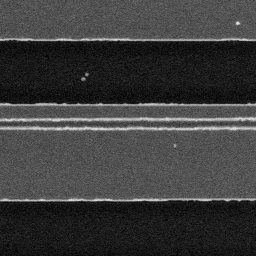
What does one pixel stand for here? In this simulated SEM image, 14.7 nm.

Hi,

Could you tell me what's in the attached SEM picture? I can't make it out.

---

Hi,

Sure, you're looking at lines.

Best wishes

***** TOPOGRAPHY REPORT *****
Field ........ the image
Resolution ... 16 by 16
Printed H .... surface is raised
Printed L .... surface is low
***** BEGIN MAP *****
HHHHHHHHHHHHHHHH
HHHHHHHHHHHHHHHH
HHHHHHLHHHHHHHHH
LLLLLLLLLLLLLLLL
LLLLLLLLLLLLLLLL
LLLLLLLLLLLLLLLL
LLLLLLLLLLLLLLLL
HHHHHHHHHHHHHHHH
HHHHHHHHHHHHHHHH
HHHHHHHHHHHHHHHH
HHHHHHHHHHHHHHHH
HHHHHHHHHHHHHHHH
HHHHHHHHHHHLHLHL
LLLLLLLLLLLLLLLL
LLLLLLLLLLLLLLLL
LLLLLLLLLLLLLLLL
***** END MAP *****